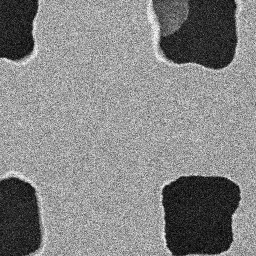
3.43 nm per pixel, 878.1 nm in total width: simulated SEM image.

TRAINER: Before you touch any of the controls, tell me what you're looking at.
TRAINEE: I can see holes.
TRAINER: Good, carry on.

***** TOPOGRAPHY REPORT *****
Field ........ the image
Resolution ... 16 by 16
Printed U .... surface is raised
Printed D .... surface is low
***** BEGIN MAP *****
DDUUUUUUUUDDDDDU
DDUUUUUUUUDDDDDU
DDUUUUUUUUDDDDDU
DDUUUUUUUUDDDDDU
UUUUUUUUUUUUUUUU
UUUUUUUUUUUUUUUU
UUUUUUUUUUUUUUUU
UUUUUUUUUUUUUUUU
UUUUUUUUUUUUUUUU
UUUUUUUUUUUUUUUU
UUUUUUUUUUUUUUUU
DDUUUUUUUUUDDDDU
DDUUUUUUUUDDDDDU
DDDUUUUUUUDDDDDU
DDDUUUUUUUDDDDDU
DDDUUUUUUUUDDDUU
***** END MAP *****